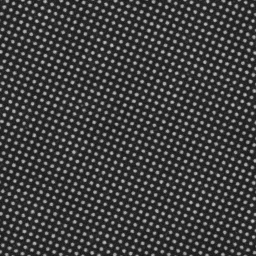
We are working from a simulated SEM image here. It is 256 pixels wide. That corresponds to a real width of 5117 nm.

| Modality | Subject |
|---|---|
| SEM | a regular array of raised bodies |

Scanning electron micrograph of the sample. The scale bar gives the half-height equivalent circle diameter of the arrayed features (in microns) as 0.0638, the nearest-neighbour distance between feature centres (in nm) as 138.